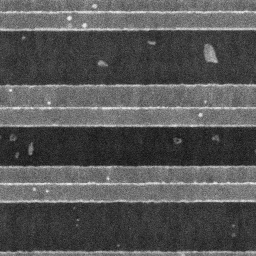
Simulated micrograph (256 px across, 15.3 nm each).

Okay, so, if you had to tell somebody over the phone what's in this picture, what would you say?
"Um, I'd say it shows lines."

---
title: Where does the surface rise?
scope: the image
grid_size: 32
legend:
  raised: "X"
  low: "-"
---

XXXXXXXXXXXXXXXXXXXXXXXXXXXXXXXX
XXXXXXXXXXXXXXXXXXXXXXXXXXXXXXXX
XXXXXXXXXXXXXXXXXXXXXXXXXXXXXXXX
XXXXXXXXXXXXXXXXXXXXXXXXXXXXXXXX
--------------------------------
--------------------------------
--------------------------------
--------------------------------
--------------------------------
--------------------------------
--------------------------------
XXXXXXXXXXXXXXXXXXXXXXXXXXXXXXXX
XXXXXXXXXXXXXXXXXXXXXXXXXXXXXXXX
XXXXXXXXXXXXXXXXXXXXXXXXXXXXXXXX
XXXXXXXXXXXXXXXXXXXXXXXXXXXXXXXX
XXXXXXXXXXXXXXXXXXXXXXXXXXXXXXXX
--------------------------------
--------------------------------
--------------------------------
--------------------------------
--------------------------------
XXXXXXXXXXXXXXXXXXXXXXXXXXXXXXXX
XXXXXXXXXXXXXXXXXXXXXXXXXXXXXXXX
XXXXXXXXXXXXXXXXXXXXXXXXXXXXXXXX
XXXXXXXXXXXXXXXXXXXXXXXXXXXXXXXX
--------------------------------
--------------------------------
--------------------------------
--------------------------------
--------------------------------
--------------------------------
----X-------X-----------X-X-X---